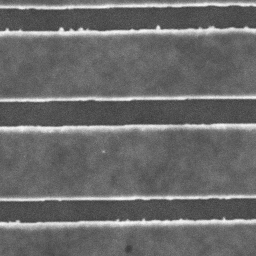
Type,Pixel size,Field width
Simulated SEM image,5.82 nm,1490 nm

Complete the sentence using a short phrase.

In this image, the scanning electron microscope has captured lines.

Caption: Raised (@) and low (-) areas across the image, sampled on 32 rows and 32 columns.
@@@@@@@@@@@@@@@@@@@@@@@@@@@@@@@@
--------------------------------
--------------------------------
--------------------------------
@@@@@@@@@@@@@@@@@@@@@@@@@@@@@@@@
@@@@@@@@@@@@@@@@@@@@@@@@@@@@@@@@
@@@@@@@@@@@@@@@@@@@@@@@@@@@@@@@@
@@@@@@@@@@@@@@@@@@@@@@@@@@@@@@@@
@@@@@@@@@@@@@@@@@@@@@@@@@@@@@@@@
@@@@@@@@@@@@@@@@@@@@@@@@@@@@@@@@
@@@@@@@@@@@@@@@@@@@@@@@@@@@@@@@@
@@@@@@@@@@@@@@@@@@@@@@@@@@@@@@@@
@@@@@@@@@---@@@@@---------------
--------------------------------
--------------------------------
--------------------------------
@@@@@@@@@@@@@@@@@@@@@@@@@@@@@@@@
@@@@@@@@@@@@@@@@@@@@@@@@@@@@@@@@
@@@@@@@@@@@@@@@@@@@@@@@@@@@@@@@@
@@@@@@@@@@@@@@@@@@@@@@@@@@@@@@@@
@@@@@@@@@@@@@@@@@@@@@@@@@@@@@@@@
@@@@@@@@@@@@@@@@@@@@@@@@@@@@@@@@
@@@@@@@@@@@@@@@@@@@@@@@@@@@@@@@@
@@@@@@@@@@@@@@@@@@@@@@@@@@@@@@@@
@@@@@@@@@@@@@@@@@@@@@@@@@@@@@@@@
--------------------------------
--------------------------------
--------------------------------
@@@@@@@@@@@@@@@@@@@@@@@@@@@@@@@@
@@@@@@@@@@@@@@@@@@@@@@@@@@@@@@@@
@@@@@@@@@@@@@@@@@@@@@@@@@@@@@@@@
@@@@@@@@@@@@@@@@@@@@@@@@@@@@@@@@